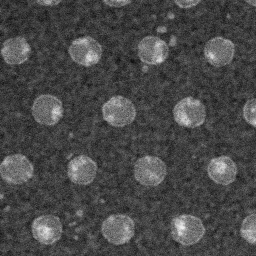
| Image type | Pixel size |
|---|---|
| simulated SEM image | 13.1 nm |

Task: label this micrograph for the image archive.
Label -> a regular array of holes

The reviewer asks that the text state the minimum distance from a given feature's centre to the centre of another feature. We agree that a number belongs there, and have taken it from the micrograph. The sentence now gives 874 nanometres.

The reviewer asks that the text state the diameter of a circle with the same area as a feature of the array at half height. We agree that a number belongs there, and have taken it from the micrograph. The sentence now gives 379 nm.